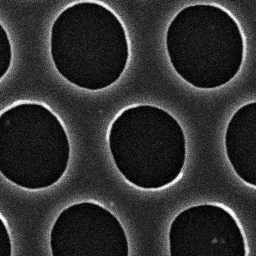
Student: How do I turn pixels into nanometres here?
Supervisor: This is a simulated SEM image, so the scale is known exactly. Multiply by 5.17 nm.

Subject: holes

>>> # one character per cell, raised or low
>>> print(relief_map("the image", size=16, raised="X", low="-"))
XXXX---XXXXX--XX
XXX-----XXX----X
-XX-----XX-----X
-XX-----XXX----X
XXXX----XXX----X
XXXXX-XXXXXXXXXX
XXXXXXXXXXXXXXXX
----XXX----XXX--
----XXX-----XX--
----XXX-----XX--
----XXX----XXXX-
X--XXXXX--XXXXXX
XXXXXXXXXXXXXXXX
XXXX---XXXX---XX
XXX-----XXX----X
-XX-----XXX----X